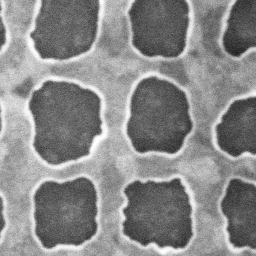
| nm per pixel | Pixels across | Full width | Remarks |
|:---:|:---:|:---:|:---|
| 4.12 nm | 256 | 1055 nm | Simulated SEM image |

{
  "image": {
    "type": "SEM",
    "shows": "holes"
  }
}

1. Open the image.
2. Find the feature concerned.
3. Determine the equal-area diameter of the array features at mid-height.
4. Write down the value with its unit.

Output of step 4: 0.302 microns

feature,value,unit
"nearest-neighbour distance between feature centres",92.1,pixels